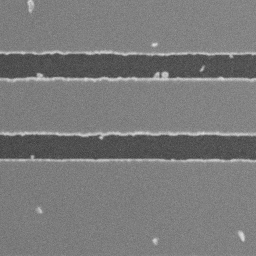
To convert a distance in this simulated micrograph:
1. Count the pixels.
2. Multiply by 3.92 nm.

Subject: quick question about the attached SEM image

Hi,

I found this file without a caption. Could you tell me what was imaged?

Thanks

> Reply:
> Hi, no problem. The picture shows lines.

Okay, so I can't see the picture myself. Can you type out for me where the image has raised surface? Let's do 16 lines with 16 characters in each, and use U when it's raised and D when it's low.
UUUUUUUUUUUUUUUU
UUUUUUUUUUUUUUUU
UUUUUUUUUUUUUUUU
DDDDDDDDDDDDDDDD
DDDDDDDDDDDDDDDD
UUUUUUUUUUUUUUUU
UUUUUUUUUUUUUUUU
UUUUUUUUUUUUUUUU
DDDDDUDDDDDDDDDD
DDDDDDDDDDDDDDDD
UUUUUUUUUUUUUUUU
UUUUUUUUUUUUUUUU
UUUUUUUUUUUUUUUU
UUUUUUUUUUUUUUUU
UUUUUUUUUUUUUUUU
UUUUUUUUUUUUUUUU